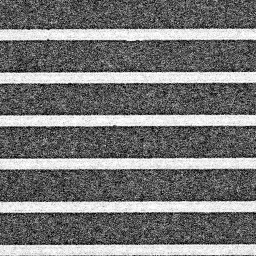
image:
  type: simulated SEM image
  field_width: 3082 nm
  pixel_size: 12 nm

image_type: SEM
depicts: parallel lines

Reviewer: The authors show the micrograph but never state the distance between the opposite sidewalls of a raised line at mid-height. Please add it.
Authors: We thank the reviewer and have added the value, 117 nm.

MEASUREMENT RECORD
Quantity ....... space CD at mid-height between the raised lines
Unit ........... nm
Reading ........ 396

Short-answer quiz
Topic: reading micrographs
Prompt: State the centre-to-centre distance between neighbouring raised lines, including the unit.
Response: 518 nm